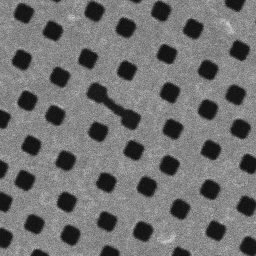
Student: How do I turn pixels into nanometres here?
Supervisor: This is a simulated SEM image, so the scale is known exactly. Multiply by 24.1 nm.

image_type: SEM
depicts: a regular array of holes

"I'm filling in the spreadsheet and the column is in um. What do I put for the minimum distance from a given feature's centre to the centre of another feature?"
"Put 0.875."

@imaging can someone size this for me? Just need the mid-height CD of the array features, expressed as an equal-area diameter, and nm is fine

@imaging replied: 485